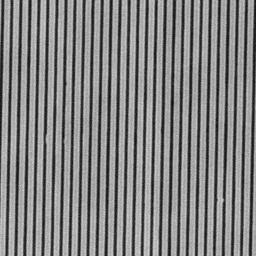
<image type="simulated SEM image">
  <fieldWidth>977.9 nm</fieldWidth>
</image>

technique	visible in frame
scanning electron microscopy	parallel lines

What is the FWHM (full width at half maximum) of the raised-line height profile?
21.5 nm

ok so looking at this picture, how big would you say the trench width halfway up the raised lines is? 0.0143 µm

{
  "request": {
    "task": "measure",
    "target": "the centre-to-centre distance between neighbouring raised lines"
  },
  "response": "0.0345 µm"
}